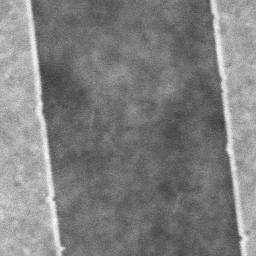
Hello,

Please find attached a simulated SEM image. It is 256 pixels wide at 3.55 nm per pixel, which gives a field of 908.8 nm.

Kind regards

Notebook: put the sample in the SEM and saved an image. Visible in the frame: one or a few lines or trenches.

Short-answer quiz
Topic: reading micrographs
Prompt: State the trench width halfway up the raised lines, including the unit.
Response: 651 nm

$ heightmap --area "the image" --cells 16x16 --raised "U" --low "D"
UUDDDDDDDDDDDUUU
UUDDDDDDDDDDDDUU
UUDDDDDDDDDDDDUU
UUDDDDDDDDDDDDUU
UUDDDDDDDDDDDDUU
UUDDDDDDDDDDDDUU
UUDDDDDDDDDDDDUU
UUUDDDDDDDDDDDUU
UUUDDDDDDDDDDDUU
UUUDDDDDDDDDDDUU
UUUDDDDDDDDDDDDU
UUUDDDDDDDDDDDDU
UUUDDDDDDDDDDDDU
UUUDDDDDDDDDDDDU
UUUUDDDDDDDDDDDU
UUUUDDDDDDDDDDDU